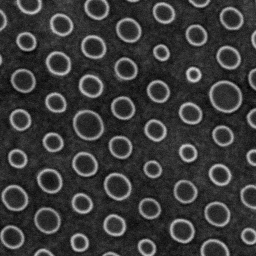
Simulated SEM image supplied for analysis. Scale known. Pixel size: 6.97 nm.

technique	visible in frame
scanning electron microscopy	a regular array of raised bodies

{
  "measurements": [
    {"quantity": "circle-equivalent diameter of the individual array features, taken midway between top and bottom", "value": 0.15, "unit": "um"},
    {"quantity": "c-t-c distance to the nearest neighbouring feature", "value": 270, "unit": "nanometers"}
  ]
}